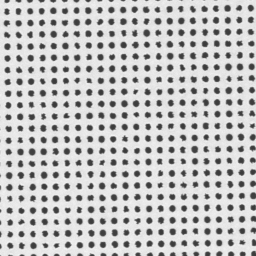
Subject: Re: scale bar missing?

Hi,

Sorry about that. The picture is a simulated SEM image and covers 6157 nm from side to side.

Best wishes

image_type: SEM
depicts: a regular array of holes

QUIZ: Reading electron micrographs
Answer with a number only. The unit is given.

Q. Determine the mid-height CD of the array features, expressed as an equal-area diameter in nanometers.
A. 156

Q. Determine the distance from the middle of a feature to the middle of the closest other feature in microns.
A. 0.275